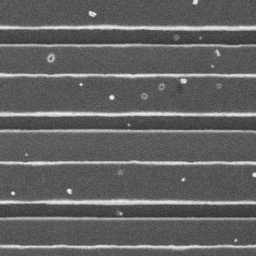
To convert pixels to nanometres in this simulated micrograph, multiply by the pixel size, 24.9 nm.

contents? lines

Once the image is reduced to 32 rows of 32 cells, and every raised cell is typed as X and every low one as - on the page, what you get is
XXXXXXXXXXXXXXXXXXXXXXXXXXXXXXXX
XXXXXXXXXXXXXXXXXXXXXXXXXXXXXXXX
XXXXXXXXXXXXXXXXXXXXXXXXXXXXXXXX
----X----------XXXXXXXXXXXX-XXXX
--------------------------------
--------------------------------
--------------------------------
--------------------------------
--------------------------------
XXXXXXXXXXXXXXXXXXXXXXXXXXXXXXXX
XXXXXXXXXXXXXXXXXXXXXXXXXXXXXXXX
XXXXXXXXXXXXXXXXXXXXXXXXXXXXXXXX
XXXXXXXXXXXXXXXXXXXXXXXXXXXXXXXX
XXXXXXXXXXXXXXXXXXXXXXXXXXXXXXXX
--------------------------------
--------------------------------
--------------------------------
--------------------------------
--------------------------------
--------------------------------
XXXXXXXXXXXXXXXXXXXXXXXXXXXXXXXX
XXXXXXXXXXXXXXXXXXXXXXXXXXXXXXXX
XXXXXXXXXXXXXXXXXXXXXXXXXXXXXXXX
XXXXXXXXXXXXXXXXXXXXXXXXXXXXXXXX
XXXXXXXXXXXXXXXXXXXXXXXXXXXXXXXX
--------------------------------
--------------------------------
--------------------------------
--------------------------------
--------------------------------
--------------------------------
XXXXXXXXXXXXXXXXXXXXXXXXXXXXXXXX